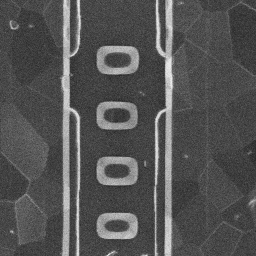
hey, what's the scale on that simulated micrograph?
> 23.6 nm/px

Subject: wiring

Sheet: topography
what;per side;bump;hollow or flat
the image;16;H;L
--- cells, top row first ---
HHHHLLLLLLHHHHHH
HHHHLLLLLLHHHHHH
HHHHLLLLLLHHHHHH
HHHHLLLHLLHHHHHH
HHHHLLLLLLLHHHHH
HHHHLLLLLLLHHHHH
HHHHLLLLLLLHHHHH
HHHHLLLHLLHHHHHH
HHHHLLLLLLHHHHHH
HHHHLLLLLLHHHHHH
HHHHLLLHLLHHHHHH
HHHHLLLLLLHHHHHH
HHHHLLLLLLHHHHHH
HHHHLLLLLLHHHHHH
HHHHLLLHLLHHHHHH
HHHHLLLLLLHHHHHH